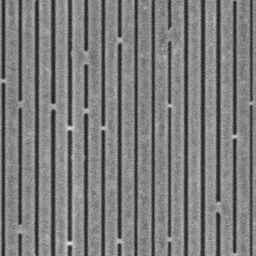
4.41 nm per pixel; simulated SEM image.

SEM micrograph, parallel lines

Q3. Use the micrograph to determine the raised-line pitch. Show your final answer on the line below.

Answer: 0.073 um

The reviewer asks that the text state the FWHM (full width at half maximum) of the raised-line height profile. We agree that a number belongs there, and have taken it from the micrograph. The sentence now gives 0.0551 µm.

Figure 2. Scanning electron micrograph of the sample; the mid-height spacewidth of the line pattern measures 19.3 nanometres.